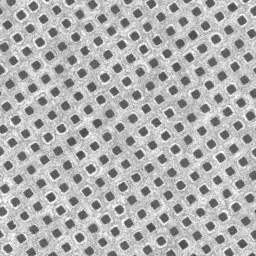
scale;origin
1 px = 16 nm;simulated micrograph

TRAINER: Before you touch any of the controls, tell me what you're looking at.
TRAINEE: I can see a regular array of holes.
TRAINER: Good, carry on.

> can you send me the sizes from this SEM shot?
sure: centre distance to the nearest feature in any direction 254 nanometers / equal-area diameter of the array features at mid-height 152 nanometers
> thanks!